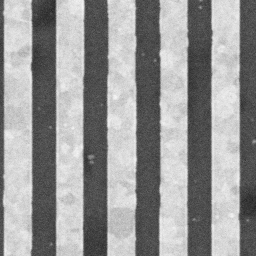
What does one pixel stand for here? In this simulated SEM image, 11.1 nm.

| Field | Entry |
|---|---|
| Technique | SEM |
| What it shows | lines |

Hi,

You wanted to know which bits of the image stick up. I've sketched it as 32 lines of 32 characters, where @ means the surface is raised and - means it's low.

-@@@---@@@----@@@---@@@----@@@--
-@@@---@@@----@@@---@@@----@@@--
-@@@---@@@----@@@---@@@----@@@--
-@@@---@@@----@@@---@@@----@@@--
-@@@---@@@----@@@---@@@----@@@--
-@@@---@@@----@@@---@@@----@@@--
-@@@---@@@----@@@---@@@----@@@--
-@@@---@@@----@@@---@@@----@@@--
-@@@---@@@----@@@---@@@----@@@--
-@@@---@@@----@@@---@@@----@@@--
-@@@---@@@----@@@---@@@----@@@--
-@@@---@@@----@@@---@@@----@@@--
-@@@---@@@----@@@---@@@----@@@--
-@@@---@@@----@@@---@@@----@@@--
-@@@---@@@----@@@---@@@----@@@--
-@@@---@@@----@@@---@@@----@@@--
-@@@---@@@----@@@---@@@----@@@--
-@@@---@@@----@@@---@@@----@@@--
-@@@---@@@----@@@---@@@----@@@--
-@@@---@@@----@@@---@@@----@@@--
-@@@---@@@----@@@---@@@----@@@--
-@@@---@@@----@@@---@@@----@@@--
-@@@---@@@----@@@---@@@----@@@--
-@@@---@@@----@@@---@@@----@@@--
-@@@---@@@----@@@---@@@----@@@--
-@@@---@@@----@@@---@@@----@@@--
-@@@---@@@----@@@---@@@----@@@--
-@@@---@@@----@@@---@@@----@@@--
-@@@---@@@----@@@---@@@----@@@--
-@@@---@@@----@@@---@@@----@@@--
-@@@---@@@----@@@---@@@----@@@--
-@@@---@@@----@@@---@@@----@@@--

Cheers